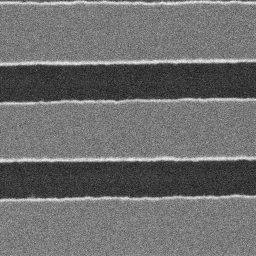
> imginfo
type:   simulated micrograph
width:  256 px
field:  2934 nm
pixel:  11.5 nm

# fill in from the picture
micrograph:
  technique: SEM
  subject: lines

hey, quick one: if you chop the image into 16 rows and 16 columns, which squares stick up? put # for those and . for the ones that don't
################
################
################
################
................
................
################
################
################
################
................
................
################
################
################
################